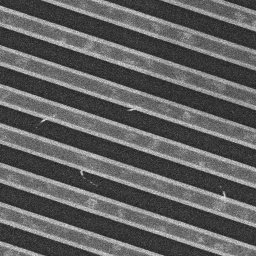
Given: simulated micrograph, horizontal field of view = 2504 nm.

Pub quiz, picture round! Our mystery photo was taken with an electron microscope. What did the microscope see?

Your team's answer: parallel lines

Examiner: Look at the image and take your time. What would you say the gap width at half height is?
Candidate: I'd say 214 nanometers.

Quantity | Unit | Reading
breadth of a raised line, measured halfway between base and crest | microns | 0.154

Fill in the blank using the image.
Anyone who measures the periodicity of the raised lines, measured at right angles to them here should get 364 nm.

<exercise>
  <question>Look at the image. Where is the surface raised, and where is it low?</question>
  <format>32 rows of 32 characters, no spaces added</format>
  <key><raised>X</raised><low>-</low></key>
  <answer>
-------XXXXXXX--------XXXXXXX---
XX--------XXXXXXX--------XXXXXXX
XXXXX--------XXXXXXX--------XXXX
-XXXXXXX--------XXXXXXX---------
----XXXXXXX--------XXXXXXX------
--------XXXXXX--------XXXXXXX---
XX--------XXXXXXX---------XXXXXX
XXXXX--------XXXXXXX---------XXX
--XXXXXX---------XXXXXX---------
-----XXXXXX---------XXXXXX------
--------XXXXXX---------XXXXXX---
XX---------XXXXXX---------XXXXXX
XXXXXX--------XXXXXX---------XXX
--XXXXXXX--------XXXXXX---------
-----XXXXXXX--------XXXXXX------
--------XXXXXXX--------XXXXXX---
XXX--------XXXXXXX--------XXXXXX
XXXXXX--------XXXXXXX--------XXX
--XXXXXXX--------XXXXXXX--------
-----XXXXXXX---------XXXXXX-----
--------XXXXXXX---------XXXXXX--
XXX---------XXXXXX---------XXXXX
XXXXXX---------XXXXXX---------XX
---XXXXXX---------XXXXXX--------
------XXXXXX---------XXXXXX-----
---------XXXXXX---------XXXXXX--
XXX---------XXXXXX---------XXXXX
XXXXXX---------XXXXXX---------XX
---XXXXXX---------XXXXXX--------
------XXXXXX---------XXXXXX-----
---------XXXXXX---------XXXXXX--
XXX---------XXXXXX---------XXXXX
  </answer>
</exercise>